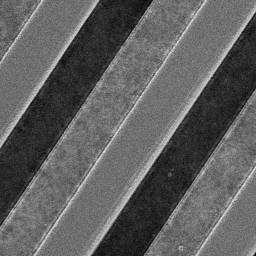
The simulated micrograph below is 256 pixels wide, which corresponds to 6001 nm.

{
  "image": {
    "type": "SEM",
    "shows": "lines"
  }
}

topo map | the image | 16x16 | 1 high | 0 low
1111110001111111
1111100001111110
1111100011111110
1111000111111100
1110000111111000
1100001111111000
1100011111110001
1000011111100001
1000111111100011
0001111111000111
0001111110000111
0011111110001111
0111111100011111
0111111000011111
1111111000111111
1111110001111111